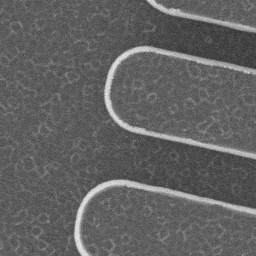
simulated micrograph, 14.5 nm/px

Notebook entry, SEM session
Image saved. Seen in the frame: one or a few lines or trenches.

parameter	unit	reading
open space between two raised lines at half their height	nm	752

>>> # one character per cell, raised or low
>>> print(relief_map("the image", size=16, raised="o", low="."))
..........oooooo
..............oo
................
........ooo.....
.......ooooooooo
.......ooooooooo
.......ooooooooo
.......ooooooooo
..........oooooo
...............o
................
.......o........
.....oooooooo...
.....ooooooooooo
.....ooooooooooo
.....ooooooooooo